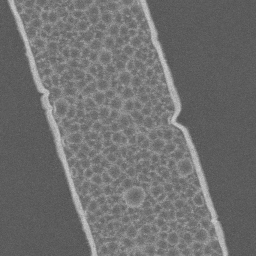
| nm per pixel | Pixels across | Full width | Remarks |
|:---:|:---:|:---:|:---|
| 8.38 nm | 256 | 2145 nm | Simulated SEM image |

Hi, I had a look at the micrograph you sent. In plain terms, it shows one or a few lines or trenches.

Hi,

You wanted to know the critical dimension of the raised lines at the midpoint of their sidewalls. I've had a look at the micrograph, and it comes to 1040 nanometres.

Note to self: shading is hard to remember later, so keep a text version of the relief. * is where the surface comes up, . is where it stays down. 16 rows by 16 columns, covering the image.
.********.......
.********.......
..********......
..********......
..********......
...********.....
...********.....
...********.....
....********....
....********....
....********....
....*********...
.....********...
.....********...
......********..
......********..